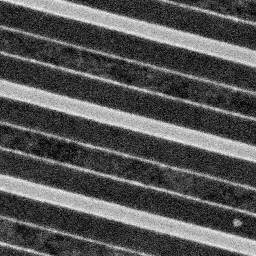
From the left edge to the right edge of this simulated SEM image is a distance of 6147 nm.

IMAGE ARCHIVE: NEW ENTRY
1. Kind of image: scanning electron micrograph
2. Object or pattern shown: lines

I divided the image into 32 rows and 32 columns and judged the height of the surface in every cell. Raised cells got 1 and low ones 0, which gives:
00111111100000000000001111111111
00000011111110000000000000111111
00000000001111111000000000000011
10000000000000111111100000000000
11111000000000000111111110000000
11111111000000000000011111110000
11111111111100000000000001111111
00011111111111110000000000000111
00000001111111111111000000000000
00000000000111111111111100000000
11000000000000011111111111100000
11111100000000000001111111111110
00111111100000000000001111111111
00000011111110000000000000111111
00000000001111111000000000000011
10000000000000111111100000000000
11111000000000000011111110000000
11111111000000000000011111110000
11111111111100000000000001111111
00001111111111110000000000000111
00000000111111111111000000000000
00000000000111111111111100000000
11100000000000011111111111110000
11111100000000000001111111111110
00011111110000000000000111111111
00000001111111000000000000111111
00000000000111111100000000000011
11000000000000111111110000000000
11111000000000000011111111000000
11111111100000000000001111111000
11111111111110000000000000111111
00001111111111111000000000000011